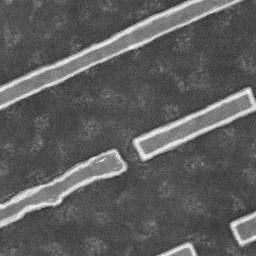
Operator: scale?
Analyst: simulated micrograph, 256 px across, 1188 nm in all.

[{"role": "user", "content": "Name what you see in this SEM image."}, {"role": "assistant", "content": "one or a few lines or trenches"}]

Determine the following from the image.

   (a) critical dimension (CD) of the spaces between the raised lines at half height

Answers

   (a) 412 nm